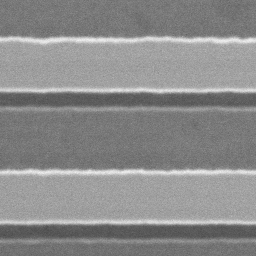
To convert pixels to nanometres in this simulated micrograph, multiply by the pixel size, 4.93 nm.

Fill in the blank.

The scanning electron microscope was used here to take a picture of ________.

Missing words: lines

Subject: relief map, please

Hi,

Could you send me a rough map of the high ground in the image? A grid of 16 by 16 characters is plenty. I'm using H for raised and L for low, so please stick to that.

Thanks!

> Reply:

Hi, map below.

LLLLLLLLLLLLLLLL
LLLLLLLLLLLLLLLL
HHHHHHHHHHHHHHHH
HHHHHHHHHHHHHHHH
HHHHHHHHHHHHHHHH
HHHHHHHHHHHHHHHH
LLLLLLLLLLLLLLLL
LLLLLLLLLLLLLLLL
LLLLLLLLLLLLLLLL
LLLLLLLLLLLLLLLL
LLLLLLLLLLLLLLLL
HHHHHHHHHHHHHHHH
HHHHHHHHHHHHHHHH
HHHHHHHHHHHHHHHH
LLLLLLLLLLLLLLLL
LLLLLLLLLLLLLLLL